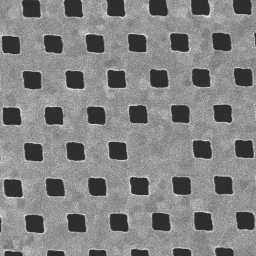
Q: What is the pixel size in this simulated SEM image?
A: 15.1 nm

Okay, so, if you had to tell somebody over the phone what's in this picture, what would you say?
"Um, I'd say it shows a regular array of holes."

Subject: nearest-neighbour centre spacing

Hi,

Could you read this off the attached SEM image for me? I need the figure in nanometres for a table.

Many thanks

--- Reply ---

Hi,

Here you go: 624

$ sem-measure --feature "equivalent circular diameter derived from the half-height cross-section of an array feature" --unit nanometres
299